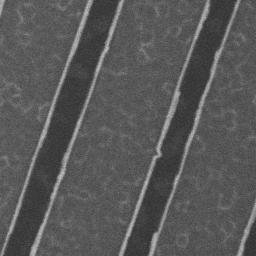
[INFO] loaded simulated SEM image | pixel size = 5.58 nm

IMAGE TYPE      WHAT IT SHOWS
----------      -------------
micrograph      one or a few lines or trenches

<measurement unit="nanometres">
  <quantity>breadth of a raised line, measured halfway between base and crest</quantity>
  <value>172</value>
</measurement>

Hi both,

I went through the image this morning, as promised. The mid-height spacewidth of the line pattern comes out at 0.451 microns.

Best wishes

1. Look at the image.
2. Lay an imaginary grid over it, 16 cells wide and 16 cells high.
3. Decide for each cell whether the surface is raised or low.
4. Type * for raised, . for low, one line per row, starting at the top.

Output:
.....***.....**.
.....**.....**..
.....**.....**..
....***.....**..
....**.....**...
....**.....**...
...**......**...
...**.....**....
...**.....**....
..**......**....
..**.....**.....
..**.....**.....
.**......**.....
.**.....**......
.**.....**.....*
**......**.....*